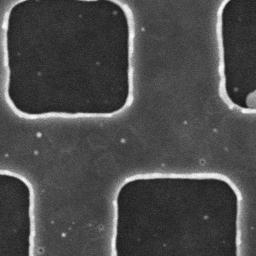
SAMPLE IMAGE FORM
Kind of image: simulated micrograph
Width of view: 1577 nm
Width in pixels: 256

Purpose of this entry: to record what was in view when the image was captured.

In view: holes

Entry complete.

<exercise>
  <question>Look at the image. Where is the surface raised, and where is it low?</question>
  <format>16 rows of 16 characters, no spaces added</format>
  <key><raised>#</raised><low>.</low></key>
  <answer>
#.......######..
#.......######..
........######..
........######..
#.......######..
........######..
#.......#######.
################
################
################
################
..######......##
..#####........#
..#####........#
..#####........#
..#####........#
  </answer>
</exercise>